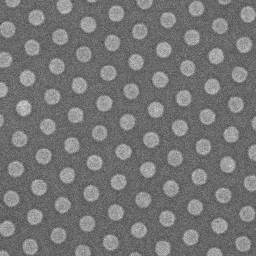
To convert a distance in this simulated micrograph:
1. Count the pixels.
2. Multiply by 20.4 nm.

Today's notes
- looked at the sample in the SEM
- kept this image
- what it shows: a regular array of raised bodies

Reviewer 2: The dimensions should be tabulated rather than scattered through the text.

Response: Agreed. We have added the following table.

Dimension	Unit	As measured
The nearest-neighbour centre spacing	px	29.7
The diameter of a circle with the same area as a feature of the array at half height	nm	306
